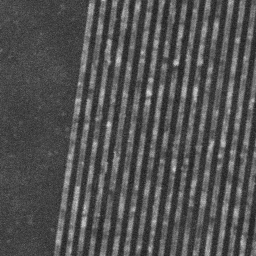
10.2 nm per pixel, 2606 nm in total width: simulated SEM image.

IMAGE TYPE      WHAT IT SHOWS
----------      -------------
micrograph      parallel lines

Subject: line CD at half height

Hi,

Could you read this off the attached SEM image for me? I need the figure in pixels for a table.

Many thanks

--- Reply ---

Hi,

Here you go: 4.7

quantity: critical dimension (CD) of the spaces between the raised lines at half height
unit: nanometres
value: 76.9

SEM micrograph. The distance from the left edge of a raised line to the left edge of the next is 117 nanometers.